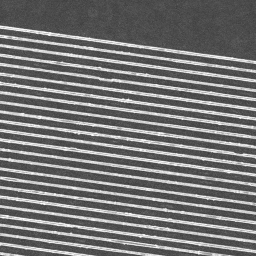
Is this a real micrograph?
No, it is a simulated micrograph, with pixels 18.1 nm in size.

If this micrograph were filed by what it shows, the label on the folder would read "parallel lines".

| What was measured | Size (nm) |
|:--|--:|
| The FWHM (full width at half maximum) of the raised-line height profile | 40.4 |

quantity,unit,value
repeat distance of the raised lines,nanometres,170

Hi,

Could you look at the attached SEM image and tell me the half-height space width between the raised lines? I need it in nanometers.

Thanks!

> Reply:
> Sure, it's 137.